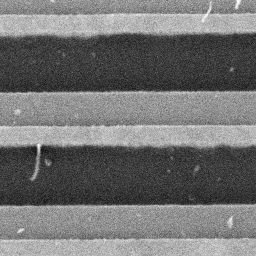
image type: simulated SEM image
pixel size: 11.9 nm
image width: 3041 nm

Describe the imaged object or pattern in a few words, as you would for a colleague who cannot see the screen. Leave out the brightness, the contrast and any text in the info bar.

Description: lines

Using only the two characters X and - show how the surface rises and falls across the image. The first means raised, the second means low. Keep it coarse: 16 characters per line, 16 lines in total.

XXXXXXXXXXXXXXXX
XXXXXXXXXXXXXXXX
----------------
----------------
----------------
----------------
XXXXXXXXXXXXXXXX
XXXXXXXXXXXXXXXX
XXXXXXXXXXXXXXXX
----------------
----------------
----------------
----------------
XXXXXXXXXXXXXXXX
XXXXXXXXXXXXXXXX
XXXXXXXXXXXXXXXX